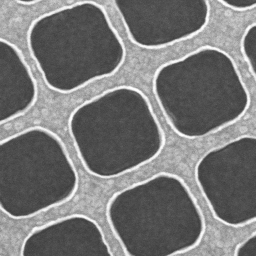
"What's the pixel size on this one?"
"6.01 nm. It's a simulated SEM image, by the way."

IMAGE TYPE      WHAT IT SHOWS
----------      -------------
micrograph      holes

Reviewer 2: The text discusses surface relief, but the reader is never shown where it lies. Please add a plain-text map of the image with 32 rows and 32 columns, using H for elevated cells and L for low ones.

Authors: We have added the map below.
HHHHHHHHHHLHHHLLLLLLLLLLLLHHHLLL
HHHHHHHLLLLLLHHLLLLLLLLLLLHHHHHH
HHHHHLLLLLLLLHHHLLLLLLLLLLHHHHHH
HHHHLLLLLLLLLLHHLLLLLLLLLHHHHHHL
HHHHLLLLLLLLLLHHHLLLLLLHHHHHHHHL
LHHHLLLLLLLLLLLHHHLLHHHHHHHHHHLL
LLHHLLLLLLLLLLLHHHHHHHHHHLLHHHHL
LLLHHLLLLLLLLLLHHHHHHHHLLLLLLHHL
LLLHHLLLLLLLLLHHHHHHLLLLLLLLLHHH
LLLLHHLLLLLLHHHHHHHHLLLLLLLLLLHH
LLLLHHLLLLHHHHHHHHHHLLLLLLLLLLHH
LLLLHHHHHHHHHHLLLHHHLLLLLLLLLLLH
LLLLHHHHHHHHLLLLLLHHLLLLLLLLLLLH
LLLHHHHHHHLLLLLLLLLHLLLLLLLLLLLH
LHHHHHHHHLLLLLLLLLLHHLLLLLLLLLHH
HHHHHHHHHLLLLLLLLLLLHHLLLLLLHHHH
HHHLLLHHHLLLLLLLLLLLHHLLLLHHHHHH
HLLLLLLHHLLLLLLLLLLLHHHHHHHHHHLL
LLLLLLLLHHLLLLLLLLLLHHHHHHHHLLLL
LLLLLLLLHHLLLLLLLLLHHHHHHHLLLLLL
LLLLLLLLLHHLLLLLLHHHHHHHHLLLLLLL
LLLLLLLLLHHHLLLHHHHHHHHHHLLLLLLL
LLLLLLLLLHHHHHHHHHHLLLHHHLLLLLLL
LLLLLLLLLHHHHHHHHLLLLLLHHLLLLLLL
LLLLLLLLLHHHHHHLLLLLLLLLHHLLLLLL
LLLLLLLHHHHHHHLLLLLLLLLLHHLLLLLL
HLLLHHHHHHHHHHLLLLLLLLLLLHHLLLLL
HHHHHHHHLLLHHHLLLLLLLLLLLHHHLLLH
HHHHHLLLLLLLHHLLLLLLLLLLLHHHHHHH
HHHHLLLLLLLLLHHLLLLLLLLLLHHHHHHH
HHHLLLLLLLLLLHHLLLLLLLLLHHHHHHLL
HHHLLLLLLLLLLLHHLLLLLLHHHHHHHHLL